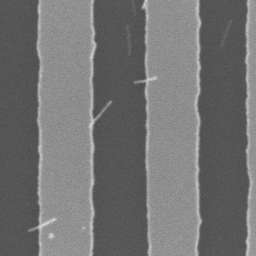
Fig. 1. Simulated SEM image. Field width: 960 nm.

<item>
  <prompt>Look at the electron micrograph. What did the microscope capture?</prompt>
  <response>lines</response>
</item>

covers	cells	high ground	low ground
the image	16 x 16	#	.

..####...###...#
..####...###...#
..####...###...#
..####...###...#
..####...###...#
..####...###...#
..####...###...#
..####...###...#
..####...###...#
..####...###...#
..####...###...#
..####...###....
..####...###....
..####...###...#
..####...###...#
..####...###...#